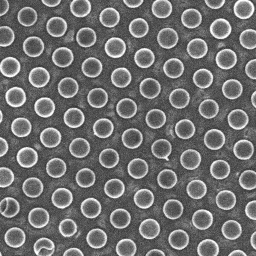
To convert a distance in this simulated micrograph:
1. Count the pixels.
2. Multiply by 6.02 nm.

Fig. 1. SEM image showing a regular array of raised bodies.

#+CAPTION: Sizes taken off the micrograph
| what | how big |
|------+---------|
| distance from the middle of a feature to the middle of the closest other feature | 184 nanometres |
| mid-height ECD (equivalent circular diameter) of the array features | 119 nm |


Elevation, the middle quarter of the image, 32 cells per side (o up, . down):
o....oooo..........oo....ooooo..
.....oooo....ooo.........ooooo..
.....oooo...ooooo........oooo...
o...........ooooo...............
ooo.........oooo....ooo.........
oooo.........ooo...ooooo........
ooo....ooo.........ooooo....oo..
ooo...ooooo........ooooo...oooo.
......ooooo..........o....ooooo.
......ooooo...oooo.........oooo.
.......ooo...ooooo.........ooo..
.ooo.........ooooo....oo........
ooooo.........oooo...oooo.......
ooooo................oooo.......
ooooo...oooo.........oooo....ooo
.ooo...ooooo.........ooo....oooo
........oooo....oo..........oooo
........oooo...oooo.........oooo
...............oooo..........oo.
..oooo.........oooo....ooo......
.ooooo.........oooo...ooooo.....
.ooooo....oo..........ooooo....o
..oooo...oooo.........oooo....oo
.........ooooo..........oo...ooo
.........oooo....ooo.........ooo
..........ooo...ooooo.........oo
....ooo.........ooooo....o......
...ooooo........ooooo...oooo....
...ooooo..........o....ooooo....
...oooo....ooo..........oooo....
....ooo...ooooo.........ooo....o
o.........ooooo....oo..........o